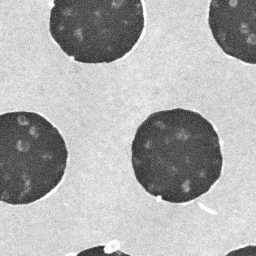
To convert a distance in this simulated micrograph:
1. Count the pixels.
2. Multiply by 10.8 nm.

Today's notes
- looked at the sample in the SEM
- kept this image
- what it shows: holes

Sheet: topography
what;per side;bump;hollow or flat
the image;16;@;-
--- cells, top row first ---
@@@------@@@@---
@@@------@@@@---
@@@------@@@@---
@@@@----@@@@@@--
@@@@@@@@@@@@@@@@
@@@@@@@@@@@@@@@@
@@@@@@@@@@@@@@@@
---@@@@@@----@@@
----@@@@------@@
----@@@@------@@
----@@@@------@@
----@@@@@----@@@
--@@@@@@@@--@@@@
@@@@@@@@@@@@@@@@
@@@@@@@@@@@@@@@@
@@@@@@@@@@@@@@@-